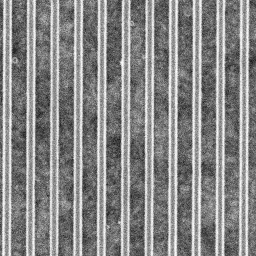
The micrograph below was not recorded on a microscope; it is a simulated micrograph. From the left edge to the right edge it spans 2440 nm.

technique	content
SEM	parallel lines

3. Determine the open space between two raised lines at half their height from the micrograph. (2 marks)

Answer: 157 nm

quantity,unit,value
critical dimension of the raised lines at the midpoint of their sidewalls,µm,0.0691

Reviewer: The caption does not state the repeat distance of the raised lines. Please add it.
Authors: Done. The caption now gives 226 nanometers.